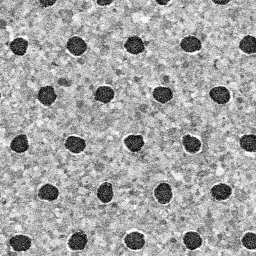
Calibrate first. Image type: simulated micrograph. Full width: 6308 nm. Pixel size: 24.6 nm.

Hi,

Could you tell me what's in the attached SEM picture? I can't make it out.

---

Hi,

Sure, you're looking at a regular array of holes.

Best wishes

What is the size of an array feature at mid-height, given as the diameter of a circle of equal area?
498 nm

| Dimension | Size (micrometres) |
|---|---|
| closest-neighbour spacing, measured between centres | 1.38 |